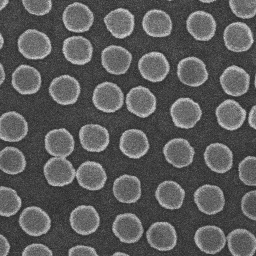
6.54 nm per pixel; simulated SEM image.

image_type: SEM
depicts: a regular array of raised bodies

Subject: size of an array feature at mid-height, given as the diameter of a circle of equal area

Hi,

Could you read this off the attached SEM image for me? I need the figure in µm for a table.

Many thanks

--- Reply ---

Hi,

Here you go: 0.181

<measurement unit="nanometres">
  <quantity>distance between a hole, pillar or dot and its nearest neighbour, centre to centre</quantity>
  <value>241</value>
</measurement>